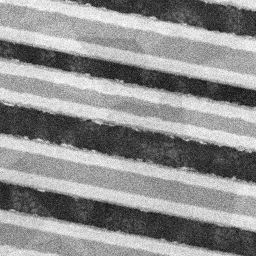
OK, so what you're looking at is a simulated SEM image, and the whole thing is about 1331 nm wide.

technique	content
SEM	one or a few lines or trenches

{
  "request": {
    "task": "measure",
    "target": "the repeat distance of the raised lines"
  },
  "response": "70.8 pixels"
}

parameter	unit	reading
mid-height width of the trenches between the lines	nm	210